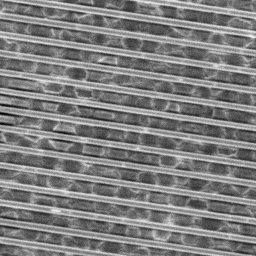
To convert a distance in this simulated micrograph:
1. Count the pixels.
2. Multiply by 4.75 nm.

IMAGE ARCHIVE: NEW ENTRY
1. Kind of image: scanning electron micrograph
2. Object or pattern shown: parallel lines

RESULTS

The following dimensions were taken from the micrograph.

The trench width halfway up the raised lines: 61.2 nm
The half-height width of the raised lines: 27.6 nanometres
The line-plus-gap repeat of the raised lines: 88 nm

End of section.